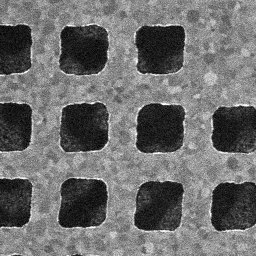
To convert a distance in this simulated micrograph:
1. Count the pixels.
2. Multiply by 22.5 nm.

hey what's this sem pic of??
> holes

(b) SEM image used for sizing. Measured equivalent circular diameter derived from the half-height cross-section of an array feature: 1190 nanometers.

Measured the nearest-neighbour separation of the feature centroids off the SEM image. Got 1.7 µm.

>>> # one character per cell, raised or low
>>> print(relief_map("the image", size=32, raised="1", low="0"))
11111111111111111111111111111111
11111111111111111111111111111111
11111111111111111111111111111111
00001111000001111000000111111111
00001111000000111000000111111111
00001111000000111000000111111111
00001111000001111000000111111111
00001110000001111000000111111111
00001111000001111000000111111111
11111111111111111111111111111111
11111111111111111111111111111111
11111111111111111111111111111111
11111111111111111111111111111111
00001111000001111100000111100000
00001111000000111000000111100000
00001111000001111000000111100000
00001111000000111000000111100000
00001110000000111000000111000000
00011111000001111000000111100000
11111111111111111111111111111111
11111111111111111111111111111111
11111111111111111111111111111111
00001111000001111111111111111111
00001111000001111000000111100000
00001111000000111000000111000000
00001111000001111000000111000000
00001110000001111000000111000000
00001110000001111000000111000000
11111111011111111000001111100001
11111111111111111111111111111111
11111111111111111111111111111111
11111111111111111111111111111111